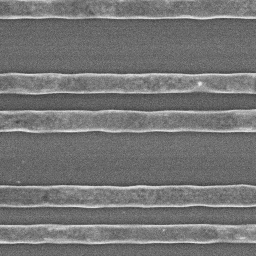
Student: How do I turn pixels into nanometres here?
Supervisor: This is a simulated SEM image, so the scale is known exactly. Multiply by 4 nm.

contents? wiring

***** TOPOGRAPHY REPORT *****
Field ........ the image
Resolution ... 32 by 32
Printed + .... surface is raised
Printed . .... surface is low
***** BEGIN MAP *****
.+++++++++++++++++++++++++++++++
+..+++++++++++++++++++++++++++++
................................
................................
................................
................................
................................
................................
................................
++++++++++++++++++++++++++++++++
++++++++++++++++++++++++++++++++
+.+++++++++++..+++++.......+++.+
................................
................................
++++++++++++++++++++++++++++++++
++.+++++++++++++++++++++++++++++
................................
................................
................................
................................
................................
................................
................................
++++++++++.+++++...+++++++++++++
+++++.+++++++++++.++++++++++++++
+++++.+++.++++++++++++++++++++++
................................
................................
++++++++++++++++++++++++++++++++
++++++++++++++++++++++++++++++++
................................
................................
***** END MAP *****